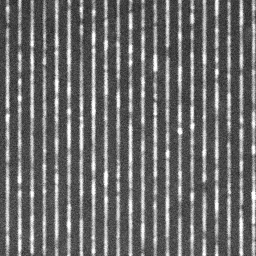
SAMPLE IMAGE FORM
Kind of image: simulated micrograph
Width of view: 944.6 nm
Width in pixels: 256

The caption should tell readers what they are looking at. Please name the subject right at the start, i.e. parallel lines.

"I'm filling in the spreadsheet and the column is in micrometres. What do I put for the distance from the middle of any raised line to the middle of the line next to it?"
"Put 0.0455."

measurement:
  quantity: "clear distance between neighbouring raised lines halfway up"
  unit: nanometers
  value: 39.2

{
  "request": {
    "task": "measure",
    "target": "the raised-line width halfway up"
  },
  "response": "6.9 nm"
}